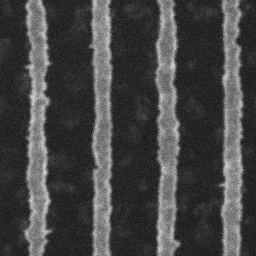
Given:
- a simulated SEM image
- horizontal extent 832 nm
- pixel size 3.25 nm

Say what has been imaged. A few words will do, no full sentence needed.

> one or a few lines or trenches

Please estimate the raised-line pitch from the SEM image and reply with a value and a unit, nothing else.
211 nanometres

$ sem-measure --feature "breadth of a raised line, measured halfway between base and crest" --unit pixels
14.6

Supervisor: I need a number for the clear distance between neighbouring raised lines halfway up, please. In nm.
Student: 163